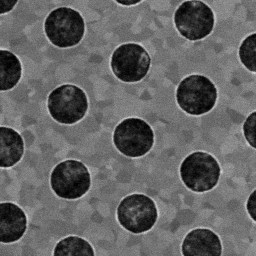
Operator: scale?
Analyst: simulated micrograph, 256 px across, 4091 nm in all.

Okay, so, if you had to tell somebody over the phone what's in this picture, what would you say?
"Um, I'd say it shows a regular array of holes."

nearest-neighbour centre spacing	1190	nm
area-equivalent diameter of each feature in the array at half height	645	nanometers